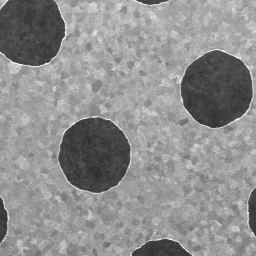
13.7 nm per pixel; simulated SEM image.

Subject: holes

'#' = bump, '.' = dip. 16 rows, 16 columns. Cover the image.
....############
....############
....############
...##########..#
############....
###########.....
###########.....
#####..#####...#
####....########
####....########
####....########
####...#########
################
################
################
#########..#####